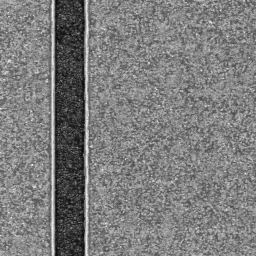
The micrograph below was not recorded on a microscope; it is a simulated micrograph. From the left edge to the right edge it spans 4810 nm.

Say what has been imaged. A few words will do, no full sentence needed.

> one or a few lines or trenches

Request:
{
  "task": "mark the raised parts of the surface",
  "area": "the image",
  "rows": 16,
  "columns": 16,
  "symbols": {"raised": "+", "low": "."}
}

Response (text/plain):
+++..+++++++++++
+++..+++++++++++
+++..+++++++++++
+++..+++++++++++
+++..+++++++++++
+++..+++++++++++
+++..+++++++++++
+++..+++++++++++
+++..+++++++++++
+++..+++++++++++
+++..+++++++++++
+++..+++++++++++
+++..+++++++++++
+++..+++++++++++
+++..+++++++++++
+++..+++++++++++